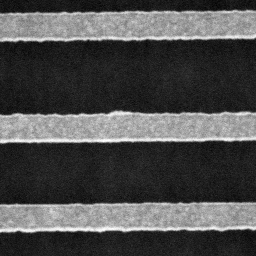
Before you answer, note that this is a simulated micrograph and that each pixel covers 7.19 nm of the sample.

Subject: lines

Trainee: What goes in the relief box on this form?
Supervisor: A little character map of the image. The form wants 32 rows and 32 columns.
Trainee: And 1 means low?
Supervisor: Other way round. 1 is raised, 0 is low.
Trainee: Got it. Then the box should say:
00000000000000000000000000000000
00000000000000011101110111111111
11111111111111111111111111111111
11111111111111111111111111111111
11111111111111111111111111111111
00000000000000000000000000000000
00000000000000000000000000000000
00000000000000000000000000000000
00000000000000000000000000000000
00000000000000000000000000000000
00000000000000000000000000000000
00000000000000000000000000000000
00000000000000000000000000000000
00000000000000000000000000000000
11111111111111111111111111111111
11111111111111111111111111111111
11111111111111111111111111111111
11111111111111111111111111000000
00000000000000000000000000000000
00000000000000000000000000000000
00000000000000000000000000000000
00000000000000000000000000000000
00000000000000000000000000000000
00000000000000000000000000000000
00000000000000000000000000000000
00000000000000000011101111111111
11111111111111111111111111111111
11111111111111111111111111111111
11111111111111111111111111111111
00000000000000000000000000000000
00000000000000000000000000000000
00000000000000000000000000000000